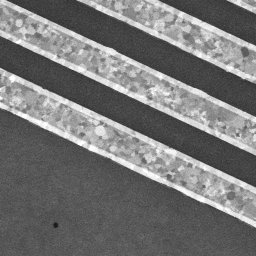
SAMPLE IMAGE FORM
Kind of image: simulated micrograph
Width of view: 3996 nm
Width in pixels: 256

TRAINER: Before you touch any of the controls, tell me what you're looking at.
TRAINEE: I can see one or a few lines or trenches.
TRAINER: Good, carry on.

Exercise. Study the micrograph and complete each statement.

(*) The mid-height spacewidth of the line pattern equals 542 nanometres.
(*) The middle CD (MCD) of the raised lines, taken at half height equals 0.465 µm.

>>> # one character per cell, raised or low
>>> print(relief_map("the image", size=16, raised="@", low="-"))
@-----@@@@------
@@@-----@@@@@---
-@@@@------@@@@-
---@@@@------@@@
-----@@@@@-----@
@@-----@@@@@----
@@@@------@@@@--
--@@@@@-----@@@@
----@@@@@-----@@
------@@@@@-----
--------@@@@@---
-----------@@@@-
-------------@@@
---------------@
----------------
----------------